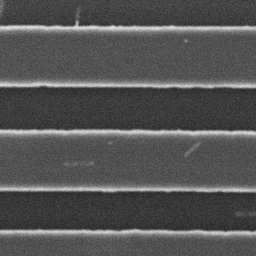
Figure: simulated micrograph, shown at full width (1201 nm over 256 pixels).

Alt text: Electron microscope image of lines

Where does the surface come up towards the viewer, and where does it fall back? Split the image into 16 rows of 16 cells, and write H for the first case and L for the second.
LLLLLLLLLLLLLLLL
LLLLLLLLLLLLLLLL
HHHHHHHHHHHHHHHH
HHHHHHHHHHHHHHHH
HHHHHHHHHHHHHHHH
LLLLLLLLLLLLLLLL
LLLLLLLLLLLLLLLL
LLLLLLLLLLLLLLLL
HHHHHHHHHHHHHHHH
HHHHHHHHHHHHHHHH
HHHHHHHHHHHHHHHH
HHHHHHHHHHHHHHHH
LLLLLLLLLLLLLLLL
LLLLLLLLLLLLLLLL
HHHHHHHHHHHHHHHH
HHHHHHHHHHHHHHHH